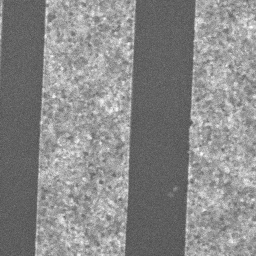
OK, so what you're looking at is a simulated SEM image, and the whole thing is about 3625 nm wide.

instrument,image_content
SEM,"one or a few lines or trenches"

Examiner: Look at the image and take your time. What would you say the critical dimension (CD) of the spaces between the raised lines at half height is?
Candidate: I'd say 872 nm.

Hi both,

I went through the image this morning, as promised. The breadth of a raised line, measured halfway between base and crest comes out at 1250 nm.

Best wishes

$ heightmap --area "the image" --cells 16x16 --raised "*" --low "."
...*****....****
...*****....****
...*****....****
...*****....****
...*****....****
...*****....****
...*****....****
...*****....****
...*****....****
..******....****
..******....****
..******....****
..******....****
..******....****
..******....****
..******....****